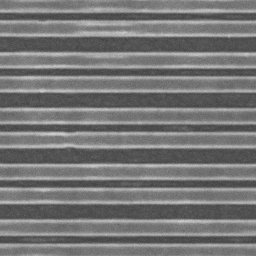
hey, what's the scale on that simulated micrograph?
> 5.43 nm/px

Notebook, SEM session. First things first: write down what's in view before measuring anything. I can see parallel lines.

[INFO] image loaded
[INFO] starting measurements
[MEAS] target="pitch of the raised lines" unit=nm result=155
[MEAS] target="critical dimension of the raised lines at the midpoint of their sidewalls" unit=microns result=0.0787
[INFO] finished